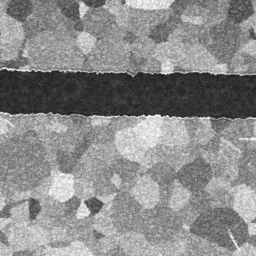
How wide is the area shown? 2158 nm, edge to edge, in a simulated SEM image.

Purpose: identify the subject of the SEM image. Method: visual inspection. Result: one or a few lines or trenches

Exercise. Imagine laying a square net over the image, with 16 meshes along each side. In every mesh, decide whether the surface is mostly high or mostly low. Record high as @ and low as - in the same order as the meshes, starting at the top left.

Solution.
@@@@@@@@@@@@@@@@
@@@@@@@@@@@@@@@@
@@@@@@@@@@@@@@@@
@@@@@@@@@@@@@@@@
------@@@@@@-@@@
----------------
----------------
@@@@@@@@@@@@@@@@
@@@@@@@@@@@@@@@@
@@@@@@@@@@@@@@@@
@@@@@@@@@@@@@@@@
@@@@@@@@@@@@@@@@
@@@@@@@@@@@@@@@@
@@@@@@@@@@@@@@@@
@@@@@@@@@@@@@@@@
@@@@@@@@@@@@@@@@